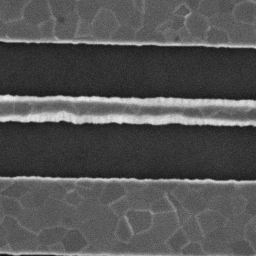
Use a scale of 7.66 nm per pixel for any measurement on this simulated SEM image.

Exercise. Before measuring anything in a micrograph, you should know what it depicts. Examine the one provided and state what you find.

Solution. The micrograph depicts lines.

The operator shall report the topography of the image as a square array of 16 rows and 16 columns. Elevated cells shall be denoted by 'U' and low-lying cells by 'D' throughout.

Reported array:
UUUUUUUUUUUUUUUU
UUUUUUUUUUUUUUUU
UUUUUUUUUUUUUUUU
DDDDDDDDDDDDDDDD
DDDDDDDDDDDDDDDD
DDDDDDDDDDDDDDDD
UUUUUUUUUUUUUUUU
DDDDUUUUUUUUUUUU
DDDDDDDDDDDDDDDD
DDDDDDDDDDDDDDDD
DDDDDDDDDDDDDDDD
UUUUUUUUUUUUUUUU
UUUUUUUUUUUUUUUU
UUUUUUUUUUUUUUUU
UUUUUUUUUUUUUUUU
UUUUUUUUUUUUUUUU